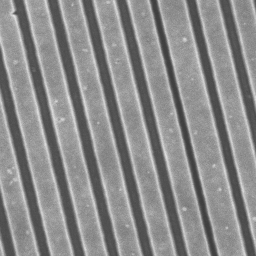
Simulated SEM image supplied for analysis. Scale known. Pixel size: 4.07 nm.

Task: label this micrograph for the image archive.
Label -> parallel lines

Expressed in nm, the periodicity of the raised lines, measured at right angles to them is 136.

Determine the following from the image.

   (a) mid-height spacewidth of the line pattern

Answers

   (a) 42.1 nm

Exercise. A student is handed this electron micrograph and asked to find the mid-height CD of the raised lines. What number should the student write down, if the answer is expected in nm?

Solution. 91.1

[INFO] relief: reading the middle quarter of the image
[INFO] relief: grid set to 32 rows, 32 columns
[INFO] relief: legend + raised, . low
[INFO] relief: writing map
...+++++...++++++...+++++..+++++
...++++++..++++++...++++++.+++++
...++++++...+++++...++++++..++++
...++++++...+++++...++++++..++++
+..++++++...++++++...+++++..++++
+...++++++..++++++...++++++.++++
+...++++++..++++++...++++++..+++
+...++++++...++++++..++++++..+++
++...+++++...++++++...+++++..+++
++...+++++...++++++...+++++..+++
++...++++++..++++++...++++++..++
++...++++++...++++++..++++++..++
+++..++++++...++++++...+++++..++
+++...+++++...++++++...+++++..++
+++...+++++...++++++...++++++..+
+++...++++++...+++++...++++++..+
++++..++++++...++++++..++++++..+
++++...+++++...++++++...+++++..+
++++...++++++..++++++...++++++.+
++++...++++++...+++++...++++++..
++++...++++++...++++++..++++++..
+++++..++++++...++++++...+++++..
+++++...++++++..++++++...++++++.
+++++...++++++...+++++...++++++.
+++++...++++++...+++++...++++++.
++++++..++++++...++++++...+++++.
++++++...++++++..++++++...++++++
++++++...++++++..++++++...++++++
.+++++...++++++...++++++..++++++
.++++++..++++++...++++++...+++++
.++++++...+++++...++++++...+++++
.++++++...++++++...+++++...+++++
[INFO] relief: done